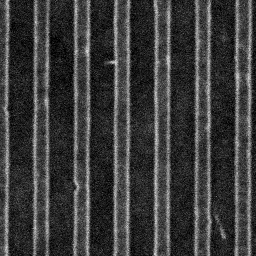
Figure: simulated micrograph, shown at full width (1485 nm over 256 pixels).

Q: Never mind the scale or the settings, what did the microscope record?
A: parallel lines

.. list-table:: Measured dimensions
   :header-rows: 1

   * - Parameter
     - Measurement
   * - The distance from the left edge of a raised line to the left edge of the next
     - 234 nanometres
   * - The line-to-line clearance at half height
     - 156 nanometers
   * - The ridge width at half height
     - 75.4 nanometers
